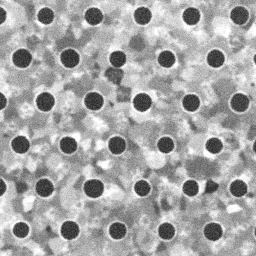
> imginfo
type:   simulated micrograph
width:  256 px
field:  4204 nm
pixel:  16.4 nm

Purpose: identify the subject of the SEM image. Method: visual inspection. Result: a regular array of holes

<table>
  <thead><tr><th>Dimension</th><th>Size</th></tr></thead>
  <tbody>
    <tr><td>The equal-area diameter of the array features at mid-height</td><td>319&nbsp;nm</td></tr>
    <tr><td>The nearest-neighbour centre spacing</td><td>48.1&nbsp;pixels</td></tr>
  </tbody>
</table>